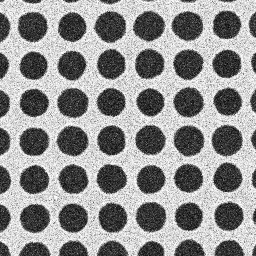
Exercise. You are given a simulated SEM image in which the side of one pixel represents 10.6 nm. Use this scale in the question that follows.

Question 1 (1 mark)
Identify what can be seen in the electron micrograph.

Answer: a regular array of holes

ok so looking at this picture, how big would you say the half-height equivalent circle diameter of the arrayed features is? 315 nm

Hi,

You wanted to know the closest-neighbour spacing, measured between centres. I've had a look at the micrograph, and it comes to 401 nanometres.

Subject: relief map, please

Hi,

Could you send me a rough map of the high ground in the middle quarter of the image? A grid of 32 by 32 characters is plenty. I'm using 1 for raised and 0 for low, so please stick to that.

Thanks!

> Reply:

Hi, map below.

00000011000000011100000001100000
00000111000000011100000001110000
00000111100000011100000011110000
00001111110001111110000111111000
11111111111111111111111111111111
11111111111111111111111111111111
00001111110000111111000111111000
00000111100000011110000001110000
00000011000000011100000001100000
00000011000000001100000001100000
00000011000000011100000001110000
00000011100000011110000011110000
00000111100000111111000011111000
10011111111111111111111111111111
11111111111111111111111111111111
10111111111001111111000111111100
00000111100000011110000011110000
00000011100000011100000001110000
00000011000000011100000001100000
00000011000000001100000001100000
00000011100000011100000001110000
00000111100000011110000011110000
00001111110000111111100111111000
11111111111111111111111111111111
11111111111111111111111111111111
10001111110000111111000111111000
00000111100000011110000001110000
00000011000000011100000001110000
00000011000000001100000001100000
00000011000000001100000001110000
00000011100000011100000001110000
00000111100000111110000011111000